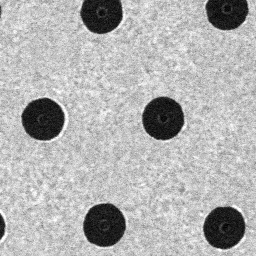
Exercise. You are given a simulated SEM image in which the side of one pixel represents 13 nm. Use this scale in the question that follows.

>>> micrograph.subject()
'ring-shaped grooves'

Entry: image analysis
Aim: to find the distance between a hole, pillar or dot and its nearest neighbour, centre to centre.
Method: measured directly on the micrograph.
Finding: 1.54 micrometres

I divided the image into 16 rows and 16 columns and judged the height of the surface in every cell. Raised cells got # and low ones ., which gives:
#####...#####..#
#####..######..#
################
################
################
################
##..#####..#####
#...#####..#####
##..#####..#####
################
################
################
################
#####...#####..#
#####...#####..#
################